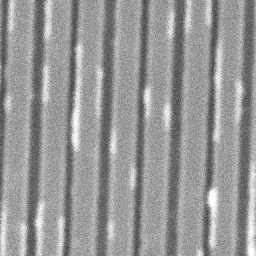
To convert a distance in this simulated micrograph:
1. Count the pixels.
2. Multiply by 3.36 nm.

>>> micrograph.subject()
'parallel lines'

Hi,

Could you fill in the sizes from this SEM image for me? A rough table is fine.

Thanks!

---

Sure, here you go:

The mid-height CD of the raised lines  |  83.1 nm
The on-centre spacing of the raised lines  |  117 nm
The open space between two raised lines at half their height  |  41.5 nm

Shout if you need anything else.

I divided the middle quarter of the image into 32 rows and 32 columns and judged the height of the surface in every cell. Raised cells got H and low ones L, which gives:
HLLLHHHHHLLLLHHHHHHLLHHHHHHLLLHH
HLLHHHHHHLLLLHHHHHLLLHHHHHHLLLHH
HLLHHHHHHLLLLHHHHHLLLHHHHHHLLLHH
HLLHHHHHHLLLLHHHHHLLLHHHHHHLLLHH
HLLHHHHHHLLLLHHHHHLLLHHHHHHLLLHH
HLLHHHHHHLLLLHHHHHLLLHHHHHHLLLHH
HLLHHHHHHLLLLHHHHHLLHHHHHHHLLLHH
HLLHHHHHHLLLLHHHHHLLHHHHHHHLLLHH
HLLHHHHHHLLLLHHHHHLLHHHHHHLLLLHH
HLLHHHHHHLLLHHHHHHLLHHHHHHLLLLHH
HLLHHHHHHLLLHHHHHHLLLHHHHHLLLLHH
HLLHHHHHHLLLHHHHHHLLHHHHHHLLLLHH
HLHHHHHHHLLLHHHHHHLLHHHHHHLLLLHH
HLHHHHHHHLLLHHHHHHLLHHHHHHLLLLHH
HLHHHHHHHLLLHHHHHHLLHHHHHHLLLLHH
HLHHHHHHHLLLHHHHHHLLHHHHHHLLLLHH
HLHHHHHHHLLLHHHHHHLLHHHHHHLLLLHH
HLHHHHHHHLLLHHHHHHLLHHHHHHLLLLHH
LLHHHHHHHLLLHHHHHHLLHHHHHHLLLLHH
LLHHHHHHHLLLHHHHHHLLHHHHHHLLLHHH
LLLHHHHHHLLLHHHHHHLLHHHHHHLLLHHH
LLLHHHHHHLLLHHHHHHLLHHHHHHLLLHHH
LLLHHHHHLLLLHHHHHHLLHHHHHHLLLHHH
LLHHHHHHLLLLHHHHHHLLHHHHHHLLLHHH
LLHHHHHHLLLLHHHHHHLLHHHHHHLLLHHH
LLHHHHHHHLLLHHHHHHLLHHHHHHLLLHHH
LLLHHHHHHLLLHHHHHHLLHHHHHHLLLHHH
LLLHHHHHLLLLHHHHHHLLHHHHHHLLLHHH
LLHHHHHHLLLLHHHHHHLLHHHHHHLLLHHH
LLHHHHHHLLLLHHHHHLLLHHHHHHLLLHHH
LLHHHHHHLLLLHHHHHLLLHHHHHHLLLHHH
LLHHHHHHLLLLHHHHHLLLHHHHHHLLLHHH